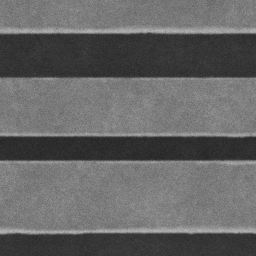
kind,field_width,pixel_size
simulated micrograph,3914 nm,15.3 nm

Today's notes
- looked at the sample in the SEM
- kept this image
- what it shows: lines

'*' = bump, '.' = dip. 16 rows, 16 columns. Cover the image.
****************
****************
................
................
................
****************
****************
****************
................
................
****************
****************
****************
****************
********........
................